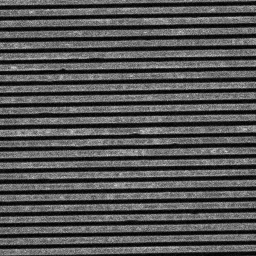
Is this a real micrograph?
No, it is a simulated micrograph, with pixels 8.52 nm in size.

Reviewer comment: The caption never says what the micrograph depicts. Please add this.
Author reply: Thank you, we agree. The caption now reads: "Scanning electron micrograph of parallel lines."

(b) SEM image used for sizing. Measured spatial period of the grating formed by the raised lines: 92.6 nm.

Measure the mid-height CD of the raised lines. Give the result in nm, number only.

58.5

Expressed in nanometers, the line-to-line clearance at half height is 34.1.